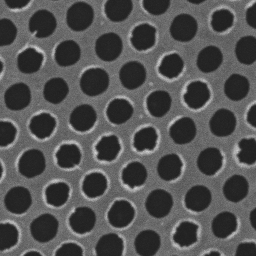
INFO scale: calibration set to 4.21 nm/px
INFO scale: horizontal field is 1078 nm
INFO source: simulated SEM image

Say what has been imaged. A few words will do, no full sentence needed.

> a regular array of holes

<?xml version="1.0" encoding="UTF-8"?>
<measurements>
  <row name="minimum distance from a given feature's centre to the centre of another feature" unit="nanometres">157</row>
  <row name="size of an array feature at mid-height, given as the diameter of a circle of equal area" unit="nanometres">112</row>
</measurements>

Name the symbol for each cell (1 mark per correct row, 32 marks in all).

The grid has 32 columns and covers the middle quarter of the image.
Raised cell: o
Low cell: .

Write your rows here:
..ooooooooooooo.....oooo......oo
oooooo....oooo......oooo......oo
ooooo......ooo.......ooo.....ooo
oooo.......ooo.......ooooo.ooooo
.ooo.......ooo......oooooooooooo
.ooo.......oooo....oooooooooooo.
.ooo.......ooooo.oooooooooooooo.
.oooo....oooooooooooo.....oooo..
ooooooooooooooooooooo......ooo..
oooooooooooo....ooooo......ooo..
oooo...oooo......oooo......oooo.
oo......ooo......oooo.....oooooo
oo......ooo......ooooo...ooooooo
o.......ooo......oooooooooooo...
o.......oooo...ooooooooooooo....
oo.....oooooooooooooooooooo.....
ooo...ooooooooooooo....ooo......
oooooooooooooooooo.....ooo......
ooooooooo....oooo......oooo.....
ooooooooo.....ooo......oooo....o
...ooooo......ooo......ooooooooo
....oooo......oooo..o.oooooooooo
....oooo.....oooooooooooooo.oooo
....oooo.....ooooooooooo.....ooo
....ooooooooooooo..ooooo.....ooo
..oooooooooooooo....ooo.......oo
ooooooooooooooo......oo......ooo
oooooo....oooo.......ooo.....ooo
ooooo......ooo.......ooo....oooo
ooooo......oooo.....oooooooooooo
.oooo......ooooo...ooooooooooooo
.oooo.....oooooooooooo...oooooo.